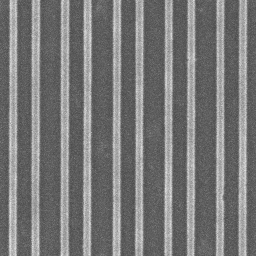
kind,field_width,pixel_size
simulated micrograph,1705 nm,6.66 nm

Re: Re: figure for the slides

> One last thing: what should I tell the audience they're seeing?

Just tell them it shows parallel lines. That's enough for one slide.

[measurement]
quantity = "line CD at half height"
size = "44.1 nanometres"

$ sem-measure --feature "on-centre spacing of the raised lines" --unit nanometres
170